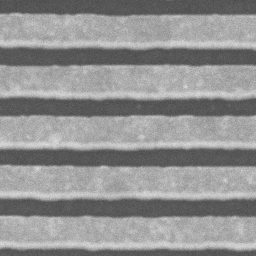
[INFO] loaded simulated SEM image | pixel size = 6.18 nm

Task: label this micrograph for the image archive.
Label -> lines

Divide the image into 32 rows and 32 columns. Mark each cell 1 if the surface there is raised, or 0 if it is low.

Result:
00000000000000000000000000000000
00000000000000000000000000000000
11111111111111111111111111111111
11111111111111111111111111111111
11111111111111111111111111111111
11111111111111111111111111111111
00000000000000000000000000000000
00000000000000000000000000000000
11111111111111111111111111111111
11111111111111111111111111111111
11111111111111111111111111111111
11111111111111111111111111111111
00000000000000000000000000000000
00000000000000000000000000000000
00000000000000000000000000000000
11111111111111111111111111111111
11111111111111111111111111111111
11111111111111111111111111111111
10111110011111111110000000000001
00000000000000000000000000000000
00000000000000000000000000000000
11111111111111111111111111111111
11111111111111111111111111111111
11111111111111111111111111111111
11111111111111111111111111111111
00000000000000000000000000000000
00000000000000000000000000000000
11111111111111111111111111111111
11111111111111111111111111111111
11111111111111111111111111111111
11111111111111111111111111111111
00000000000000000000000000000000